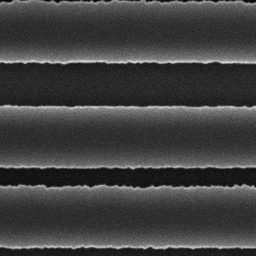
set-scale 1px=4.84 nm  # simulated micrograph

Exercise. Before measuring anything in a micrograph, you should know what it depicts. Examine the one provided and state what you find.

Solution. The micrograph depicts lines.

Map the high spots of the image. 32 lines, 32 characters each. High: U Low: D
UUUUUUUUUUUUUUUUUUUUUUUUUUUUUUUU
UUUUUUUUUUUUUUUUUUUUUUUUUUUUUUUU
UUUUUUUUUUUUUUUUUUUUUUUUUUUUUUUU
UUUUUUUUUUUUUUUUUUUUUUUUUUUUUUUU
UUUUUUUUUUUUUUUUUUUUUUUUUUUUUUUU
UUUUUUUUUUUUUUUUUUUUUUUUUUUUUUUU
UUUUUUUUUUUUUUUUUUUUUUUUUUUUUUUU
UUUUUUUUUUUUUUUUUUUUUUUUUUUUUUUU
DDDDDDDDDDDDDDDDDDDDDDDDDDDDDDDD
DDDDDDDDDDDDDDDDDDDDDDDDDDDDDDDD
DDDDDDDDDDDDDDDDDDDDDDDDDDDDDDDD
DDDDDDDDDDDDDDDDDDDDDDDDDDDDDDDD
DDDDDDDDDDDDDDDDDDDDDDDDDDDDDDDD
UUUUUUUUUUUUUUUUUUUUUUUUUUUUUUUU
UUUUUUUUUUUUUUUUUUUUUUUUUUUUUUUU
UUUUUUUUUUUUUUUUUUUUUUUUUUUUUUUU
UUUUUUUUUUUUUUUUUUUUUUUUUUUUUUUU
UUUUUUUUUUUUUUUUUUUUUUUUUUUUUUUU
UUUUUUUUUUUUUUUUUUUUUUUUUUUUUUUU
UUUUUUUUUUUUUUUUUUUUUUUUUUUUUUUU
UUUUUUUUUUUUUUUUUUUUUUUUUUUUUUUU
DDDDDDDDDDDDDDDDDDDDDDDDDDDDDDDD
DDDDDDDDDDDDDDDDDDDDDDDDDDDDDDDD
UUUUUUUUUUUUUUUUUDUUUUUUUUUUUUUU
UUUUUUUUUUUUUUUUUUUUUUUUUUUUUUUU
UUUUUUUUUUUUUUUUUUUUUUUUUUUUUUUU
UUUUUUUUUUUUUUUUUUUUUUUUUUUUUUUU
UUUUUUUUUUUUUUUUUUUUUUUUUUUUUUUU
UUUUUUUUUUUUUUUUUUUUUUUUUUUUUUUU
UUUUUUUUUUUUUUUUUUUUUUUUUUUUUUUU
UUUUUUUUUUUUUUUUUUUUUUUUUUUUUUUU
DDDDDDDDDDDDDDDDDDDDDDDDDDDDDDDD